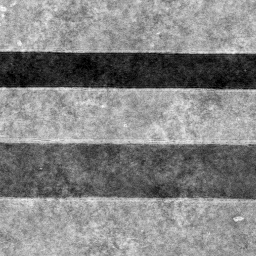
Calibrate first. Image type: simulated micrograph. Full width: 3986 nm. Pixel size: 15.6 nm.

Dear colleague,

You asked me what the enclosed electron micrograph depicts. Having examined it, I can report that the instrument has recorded lines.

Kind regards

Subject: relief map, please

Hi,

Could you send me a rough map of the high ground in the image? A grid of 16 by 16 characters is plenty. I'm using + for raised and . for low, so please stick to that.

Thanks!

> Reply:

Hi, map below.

++++++++++++++++
++++++++++++++++
++++++++++++++++
................
................
................
++++++++++++++++
++++++++++++++++
++++++++++++++++
................
................
................
++++............
++++++++++++++++
++++++++++++++++
++++++++++++++++